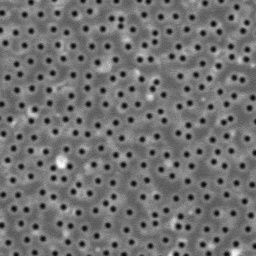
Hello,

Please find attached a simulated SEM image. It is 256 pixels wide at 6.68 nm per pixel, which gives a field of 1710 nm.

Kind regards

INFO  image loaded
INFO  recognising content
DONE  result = a regular array of holes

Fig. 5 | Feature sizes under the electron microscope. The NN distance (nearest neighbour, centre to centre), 13.4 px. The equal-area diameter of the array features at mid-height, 42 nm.